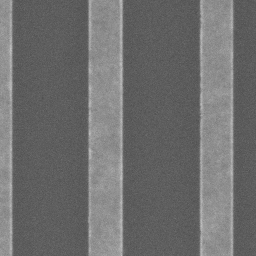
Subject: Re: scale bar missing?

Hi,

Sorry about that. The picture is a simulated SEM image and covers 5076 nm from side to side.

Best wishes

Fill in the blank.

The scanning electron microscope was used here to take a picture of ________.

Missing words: lines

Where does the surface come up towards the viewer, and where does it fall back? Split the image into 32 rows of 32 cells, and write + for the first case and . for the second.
+..........++++..........++++...
+..........++++..........++++...
+..........++++..........++++...
+..........++++..........++++...
+..........++++..........++++...
+..........++++..........++++...
+..........++++..........++++...
+..........++++..........++++...
+..........++++..........++++...
+..........++++..........++++...
+..........++++..........++++...
+..........++++..........++++...
+..........++++..........++++...
+..........++++..........++++...
+..........++++..........++++...
+..........++++..........++++...
+..........++++..........++++...
+..........++++..........++++...
+..........++++..........++++...
+..........++++..........++++...
+..........++++..........++++...
+..........++++..........++++...
+..........++++..........++++...
+..........++++..........++++...
+..........++++..........++++...
+..........++++..........++++...
+..........++++..........++++...
+..........++++..........++++...
+..........++++..........++++...
+..........++++..........++++...
+..........++++..........++++...
+..........++++..........++++...